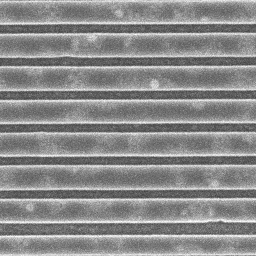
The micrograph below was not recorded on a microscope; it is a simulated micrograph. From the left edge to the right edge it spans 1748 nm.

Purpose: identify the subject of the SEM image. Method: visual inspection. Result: parallel lines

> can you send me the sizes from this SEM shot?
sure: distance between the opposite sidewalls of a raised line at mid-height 0.158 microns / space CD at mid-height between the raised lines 66.6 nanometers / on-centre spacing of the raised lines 227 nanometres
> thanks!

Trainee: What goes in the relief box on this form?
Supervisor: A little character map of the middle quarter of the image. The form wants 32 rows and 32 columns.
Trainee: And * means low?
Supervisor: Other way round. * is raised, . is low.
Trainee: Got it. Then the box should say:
................................
********************************
********************************
********************************
********************************
********************************
*********.......................
................................
................................
********************************
********************************
********************************
********************************
********************************
********************************
................................
................................
********************************
********************************
********************************
********************************
********************************
********************************
................................
................................
**********...........******...**
********************************
********************************
********************************
********************************
********************************
................................